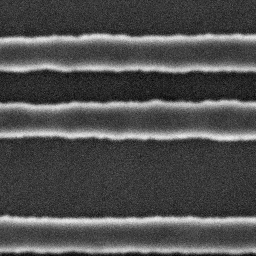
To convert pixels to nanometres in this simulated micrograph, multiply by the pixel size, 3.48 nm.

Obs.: lines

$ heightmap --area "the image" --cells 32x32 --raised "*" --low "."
................................
................................
................................
................................
...........***............*..*..
********************************
********************************
********************************
********************************
................................
................................
................................
................................
********************************
********************************
********************************
********************************
................................
................................
................................
................................
................................
................................
................................
................................
................................
................................
********************************
********************************
********************************
********************************
.**..***...*****.**.************